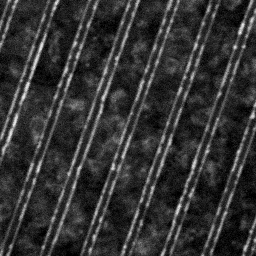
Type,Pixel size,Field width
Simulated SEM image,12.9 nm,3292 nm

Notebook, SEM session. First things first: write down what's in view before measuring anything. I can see parallel lines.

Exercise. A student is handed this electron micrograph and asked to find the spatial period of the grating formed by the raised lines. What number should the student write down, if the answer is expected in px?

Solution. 38.2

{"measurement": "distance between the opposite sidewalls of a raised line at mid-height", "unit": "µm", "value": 0.111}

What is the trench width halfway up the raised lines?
379 nm